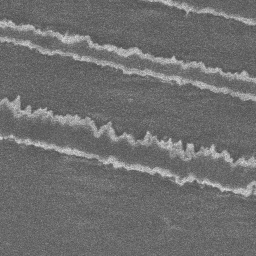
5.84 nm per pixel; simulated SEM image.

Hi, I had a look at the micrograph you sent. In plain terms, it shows one or a few lines or trenches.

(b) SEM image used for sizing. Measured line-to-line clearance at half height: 333 nanometres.